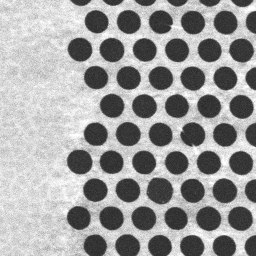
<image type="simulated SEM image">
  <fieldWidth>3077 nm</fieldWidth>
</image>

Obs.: a regular array of holes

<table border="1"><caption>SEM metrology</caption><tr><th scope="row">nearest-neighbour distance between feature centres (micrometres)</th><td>0.384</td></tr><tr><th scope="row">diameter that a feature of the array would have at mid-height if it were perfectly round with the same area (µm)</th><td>0.29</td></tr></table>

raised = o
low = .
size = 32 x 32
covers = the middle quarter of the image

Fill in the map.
ooooooo..oooooo.oooooooooooooooo
oooooo....oooo....oooo....oooo..
ooooo......oo......oo......oo...
ooooo......oo......oo......oo...
ooooo......oo......oo......oo...
oooooo....oooo.....ooo.....ooo..
ooooooooooooooooooooooo..oooooo.
oooooooooooooooooooooooooooooooo
oooooooooo....oooo....oooo....oo
ooooooooo......oo......oo......o
ooooooooo......oo......oo......o
ooooooooo......oo......oo......o
oooooooooo....oooo.....ooo.....o
oooooooooooo.oooooo..ooooooo.ooo
ooooooooooooooo.oooooooooooooooo
oooooo....oooo....oooo....oooo..
ooooo......oo......oo......ooo..
ooooo......oo......oo......oo...
ooooo......oo......oo......oo...
oooooo....oooo.....ooo.....ooo..
oooooooo.oooooo..oooooo..oooooo.
ooo..oooooo.oooooooooooooooooooo
o.....oooo....oooo....oooo....oo
o......oo......oo......oo......o
o......oo......oo......oo......o
o......oo......oo......oo......o
oo.....ooo....oooo....oooo.....o
ooo..oooooo.ooooooo..oooooo..ooo
ooooooo.oooooooooooooo...ooooooo
oooooo....oooo....ooo......ooo..
ooooo......oo......oo......oo...
ooooo......oo......oo......oo...